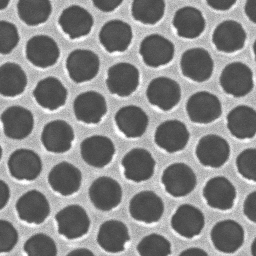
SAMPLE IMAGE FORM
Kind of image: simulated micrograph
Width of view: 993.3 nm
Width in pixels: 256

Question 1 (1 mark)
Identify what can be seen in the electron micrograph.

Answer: a regular array of holes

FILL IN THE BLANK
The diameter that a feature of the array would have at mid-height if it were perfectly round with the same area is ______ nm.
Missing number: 130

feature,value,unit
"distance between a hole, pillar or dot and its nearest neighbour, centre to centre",0.165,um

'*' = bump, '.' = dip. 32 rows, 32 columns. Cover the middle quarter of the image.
.........***......***...*****...
*........**........**********...
*.......***........***********..
**.....****........****...*****.
***..******........***......****
***********........**........***
.**********.......***........***
.***.....***.....***.........***
.**.......***********........**.
**........***********........**.
**.........*****..*****.....***.
**.........***......*****..****.
***.......***........**********.
***......****........**********.
*****....****........****....***
..***********........***......**
..************......***........*
..*************.....***........*
...***.....*****.******........*
..***.......***********........*
..**........***********.......**
.***.........****...*****....***
****.........**.......**********
*****.......***.......**********
*****.......**.........*********
...****...*****........***.....*
....***********........**.......
....***********.......***.......
....*****...***......***........
....***......*****.*****........
....***.......***********.......
....**........***********.......